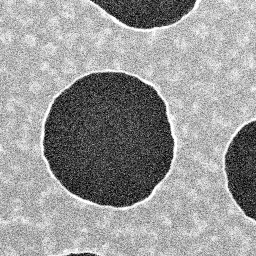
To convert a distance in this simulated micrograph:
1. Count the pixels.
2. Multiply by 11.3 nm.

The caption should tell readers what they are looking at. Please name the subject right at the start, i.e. holes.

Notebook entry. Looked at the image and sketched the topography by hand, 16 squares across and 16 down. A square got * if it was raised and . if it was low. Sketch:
******......****
********...*****
****************
****************
******.*********
****......******
***.......******
***........*****
***........****.
***........***..
***........***..
****......****..
*****....******.
***************.
****************
****************